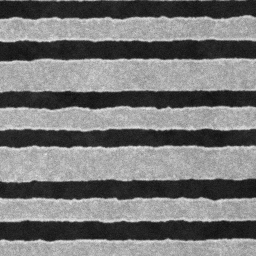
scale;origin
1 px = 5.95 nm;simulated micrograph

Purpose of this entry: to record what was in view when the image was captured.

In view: lines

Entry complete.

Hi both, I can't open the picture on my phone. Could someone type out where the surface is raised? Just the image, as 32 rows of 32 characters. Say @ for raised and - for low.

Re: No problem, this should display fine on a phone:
--------------------------------
--------------------------------
@@@@@@@@@@@@@@@@@@@@@@@@@@@@@@@@
@@@@@@@@@@@@@@@@@@@@@@@@@@@@@@@@
@@@@@@@@@@@@@@@@@@@@@@@@@@@@@@@@
--------------------------------
--------------------------------
-----@-----@@--@@@---------@@@@-
@@@@@@@@@@@@@@@@@@@@@@@@@@@@@@@@
@@@@@@@@@@@@@@@@@@@@@@@@@@@@@@@@
@@@@@@@@@@@@@@@@@@@@@@@@@@@@@@@@
--------------------------------
--------------------------------
--------@@----@@@-------@@@@@-@@
@@@@@@@@@@@@@@@@@@@@@@@@@@@@@@@@
@@@@@@@@@@@@@@@@@@@@@@@@@@@@@@@@
--------------------------------
--------------------------------
@--@@@@@@@@@@@@@@@@@@@@@@@@@@@@@
@@@@@@@@@@@@@@@@@@@@@@@@@@@@@@@@
@@@@@@@@@@@@@@@@@@@@@@@@@@@@@@@@
@@@@@@@@@@@@@@@@@@@@@@@@@@@@@@@@
@@@@-@@@@@@----@----------------
--------------------------------
--------------------------------
@@@@@@@@@@@@@@@@@@@@@@@@@@@@@@@@
@@@@@@@@@@@@@@@@@@@@@@@@@@@@@@@@
@@@--@@@@@@@@@@@@@@@@--@@@@@@@@-
--------------------------------
--------------------------------
@@@@@@@@@@@@@@@@@@@@@@@@@@@@@@@@
@@@@@@@@@@@@@@@@@@@@@@@@@@@@@@@@